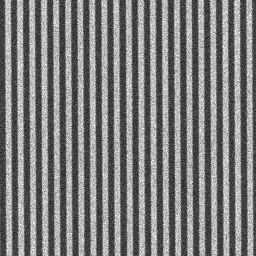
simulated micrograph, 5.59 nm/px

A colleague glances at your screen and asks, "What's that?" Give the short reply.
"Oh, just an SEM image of parallel lines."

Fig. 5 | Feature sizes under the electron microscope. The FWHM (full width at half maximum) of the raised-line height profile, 30.8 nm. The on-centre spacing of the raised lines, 67.4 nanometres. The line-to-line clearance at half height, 36.4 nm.